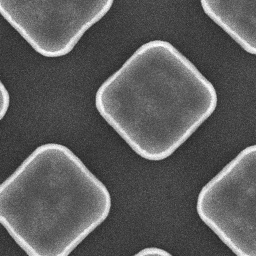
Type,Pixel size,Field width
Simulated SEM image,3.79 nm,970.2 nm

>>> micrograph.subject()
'raised bodies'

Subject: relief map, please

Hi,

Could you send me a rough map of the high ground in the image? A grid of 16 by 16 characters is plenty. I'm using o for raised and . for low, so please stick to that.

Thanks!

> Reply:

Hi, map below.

ooooooo......ooo
.ooooo........oo
..ooo..........o
........ooo.....
.......ooooo....
......ooooooo...
......ooooooo...
.......oooooo...
........oooo....
..oo.....oo....o
.oooo.........oo
oooooo.......ooo
ooooooo.....oooo
oooooo.......ooo
.ooooo........oo
..oo...........o